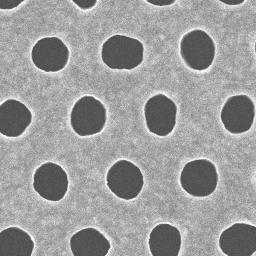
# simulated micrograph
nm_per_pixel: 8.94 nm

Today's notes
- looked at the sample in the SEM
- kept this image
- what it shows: a regular array of holes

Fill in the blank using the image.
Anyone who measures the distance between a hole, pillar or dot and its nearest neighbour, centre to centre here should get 0.659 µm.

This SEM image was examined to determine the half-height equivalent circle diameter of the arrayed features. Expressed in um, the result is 0.327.